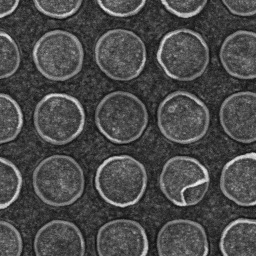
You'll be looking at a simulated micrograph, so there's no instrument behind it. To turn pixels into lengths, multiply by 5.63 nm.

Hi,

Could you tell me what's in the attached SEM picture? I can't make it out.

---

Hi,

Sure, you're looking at a regular array of raised bodies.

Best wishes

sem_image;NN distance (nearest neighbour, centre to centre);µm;0.349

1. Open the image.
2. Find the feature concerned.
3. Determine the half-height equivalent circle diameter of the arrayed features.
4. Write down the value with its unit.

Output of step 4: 49.7 px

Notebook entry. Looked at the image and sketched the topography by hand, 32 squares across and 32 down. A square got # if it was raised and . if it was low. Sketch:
##...#####..######..######..####
#....####.....###.....###....###
................................
................................
#.....###....####....####....###
##...#####..######..######..####
##..######..######..######..####
##..######..######..######..####
##...#####...#####..######..####
#.....###.....###....####.....##
................................
................................
##...####....####....####...####
##...#####..######..######..####
###.######..######..######..####
###..#####..######..######..####
##...#####...#####..######..####
#.....###.....##......##......##
................................
..............................##
#....#####...####....####...####
##..######..######..######..####
###.######..######..######..####
##..######..######..######..####
##...#####...#####...####...####
#......#......###.....##......##
................................
................................
##...####....#####..#####...####
##...#####..######..######..####
###.######..######..######..####
##...#####..######..######..####